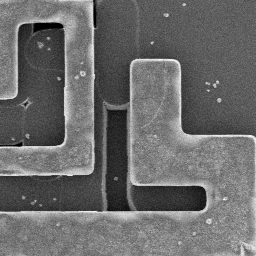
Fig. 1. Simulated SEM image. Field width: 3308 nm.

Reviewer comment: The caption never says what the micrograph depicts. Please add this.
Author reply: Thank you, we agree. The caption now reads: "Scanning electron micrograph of wiring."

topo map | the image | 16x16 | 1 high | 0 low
1111110000000000
1100110000000000
1000110000000000
1000110000000000
1000110011100000
1000110011100000
0000110011100000
0000110011100000
0000110011111111
1111110011111111
1111110011111111
0000000001111111
0000000000000111
1111111111111111
1111111111111111
1111111111111111